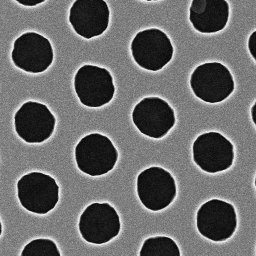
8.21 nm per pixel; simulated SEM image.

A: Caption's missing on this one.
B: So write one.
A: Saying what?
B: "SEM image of a regular array of holes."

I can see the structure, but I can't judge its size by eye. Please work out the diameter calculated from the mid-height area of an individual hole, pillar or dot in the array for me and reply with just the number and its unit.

336 nm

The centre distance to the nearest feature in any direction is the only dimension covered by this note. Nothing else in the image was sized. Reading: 0.557 um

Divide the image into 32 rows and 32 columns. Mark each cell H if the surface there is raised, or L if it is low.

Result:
HHHLLHHHHLLLLHHHHHHHHHHHLLLLHHHH
HHHHHHHHHLLLLLHHHHHHHHHHLLLLLHHH
HHHHHHHHHLLLLLHHHHHHHHHHLLLLHHHH
HHHHHHHHHLLLLHHHHHHHHHHHLLLLHHHH
HHHLLHHHHHLLHHHHHLLLLHHHHHHHHHHL
HHLLLLHHHHHHHHHHLLLLLHHHHHHHHHHL
HHLLLLLHHHHHHHHHLLLLLLHHHHHHHHHL
HHLLLLLHHHHHHHHHHLLLLHHHHHHHHHHH
HHHLLLHHHHLLLHHHHHLLHHHHHLLLHHHH
HHHHHHHHHLLLLLHHHHHHHHHHLLLLLHHH
HHHHHHHHHLLLLLHHHHHHHHHHLLLLLHHH
HHHHHHHHHHLLLLHHHHHHHHHHLLLLLHHH
HHHHHHHHHHLLLLHHHHLLHHHHHLLLHHHH
HHHLLLHHHHHHHHHHHLLLLHHHHHHHHHHH
HHLLLLLHHHHHHHHHHLLLLLHHHHHHHHHH
HHLLLLLHHHHHHHHHHLLLLLHHHHHHHHHH
HHLLLLLHHHHHHHHHHHLLLHHHHHHHHHHH
HHHLLLHHHHLLLLHHHHHHHHHHLLLLHHHH
HHHHHHHHHHLLLLHHHHHHHHHHLLLLLHHH
HHHHHHHHHLLLLLLHHHHHHHHHLLLLLHHH
HHHHHHHHHHLLLLHHHHHHHHHHHLLLLHHH
HHHHHHHHHHLLLHHHHHLLLHHHHHLHHHHH
HHHLLLLHHHHHHHHHHLLLLLHHHHHHHHHH
HHLLLLLHHHHHHHHHHLLLLLHHHHHHHHHH
HHLLLLLHHHHHHHHHHLLLLLHHHHHHHHHH
HHHLLLLHHHHHLHHHHHLLLHHHHHLLLHHH
HHHHLLHHHHLLLLLHHHHHHHHHHLLLLHHH
HHHHHHHHHHLLLLLHHHHHHHHHHLLLLLHH
HHHHHHHHHHLLLLLHHHHHHHHHHLLLLHHH
HHHHHHHHHHLLLLHHHHHHHHHHHHLLLHHH
HHHHLLLHHHHHHHHHHHLLLLHHHHHHHHHH
HHHLLLLHHHHHHHHHHHLLLLHHHHHHHHHH